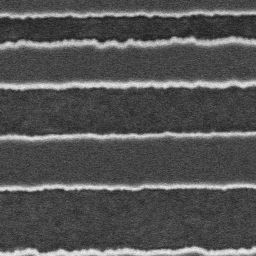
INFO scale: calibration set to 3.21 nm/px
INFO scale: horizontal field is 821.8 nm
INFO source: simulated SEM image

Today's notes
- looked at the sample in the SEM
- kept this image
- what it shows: lines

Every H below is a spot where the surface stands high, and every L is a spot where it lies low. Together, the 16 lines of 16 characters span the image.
HHHHHHHHHHHHHHHH
LLLLLLLLLLLLLLLL
LLLLLLLLLLLHLLHL
HHHHHHHHHHHHHHHH
HHHHHHHHHHHHHHHH
HHLHLLLLLLLLLLLL
LLLLLLLLLLLLLLLL
LLLLLLLLLLLLLLLL
LLLLHHLHHHHHHHHH
HHHHHHHHHHHHHHHH
HHHHHHHHHHHHHHHH
HHHHHHHHHHHHHHHH
LLLLLLLLLLLLLLLL
LLLLLLLLLLLLLLLL
LLLLLLLLLLLLLLLL
LLLLLLLLLLLLLLLL